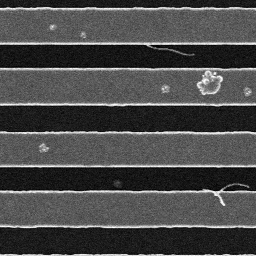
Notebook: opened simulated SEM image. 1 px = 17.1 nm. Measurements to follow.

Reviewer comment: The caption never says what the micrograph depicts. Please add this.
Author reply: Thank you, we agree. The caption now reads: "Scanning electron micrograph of lines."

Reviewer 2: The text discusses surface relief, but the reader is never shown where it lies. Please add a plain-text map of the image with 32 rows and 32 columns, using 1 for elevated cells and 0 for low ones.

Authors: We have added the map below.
00000000000000000000000000000000
11111111111111111111111111111111
11111111111111111111111111111111
11111111111111111111111111111111
11111111111111111111111111111111
11111111111111111111111111111111
00000000000000000000000000000000
00000000000000000000000000000000
00000000000000000000000000000000
11111111111111111111111111111111
11111111111111111111111111111111
11111111111111111111111111111111
11111111111111111111111111111111
00000000000000000000000000000000
00000000000000000000000000000000
00000000000000000000000000000000
10000101111111111001111100000111
11111111111111111111111111111111
11111111111111111111111111111111
11111111111111111111111111111111
11111111111111111111111111111111
00000000000000000000000000000000
00000000000000000000000000000000
00000000000000000000000000000000
11111111111111111111111111111111
11111111111111111111111111111111
11111111111111111111111111111111
11111111111111111111111111111111
00000000000000000000000000000000
00000000000000000000000000000000
00000000000000000000000000000000
00000000000000000000000000000000